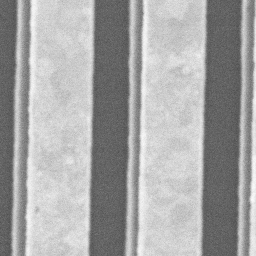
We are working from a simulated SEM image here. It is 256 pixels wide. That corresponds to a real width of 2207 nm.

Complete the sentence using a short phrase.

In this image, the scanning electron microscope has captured lines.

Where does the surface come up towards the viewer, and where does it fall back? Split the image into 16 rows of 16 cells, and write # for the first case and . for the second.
.#####..#####..#
.#####..#####..#
.#####..#####..#
.#####..#####..#
.#####..#####..#
.#####..#####..#
.#####..#####..#
.#####..#####..#
.#####..#####..#
.#####..#####..#
.#####..#####..#
.#####..#####..#
.####...####...#
.####...####...#
.####...####...#
.####...####...#